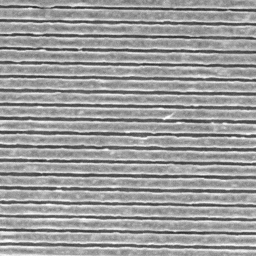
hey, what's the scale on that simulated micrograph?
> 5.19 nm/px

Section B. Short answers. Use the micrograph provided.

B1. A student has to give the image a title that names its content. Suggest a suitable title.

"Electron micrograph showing parallel lines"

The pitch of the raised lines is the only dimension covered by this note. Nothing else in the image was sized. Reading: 72.4 nm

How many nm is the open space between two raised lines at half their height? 18.8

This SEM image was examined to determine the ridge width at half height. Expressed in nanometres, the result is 53.2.